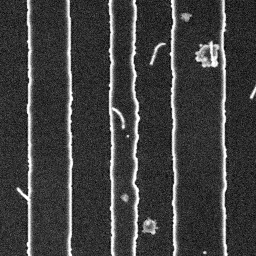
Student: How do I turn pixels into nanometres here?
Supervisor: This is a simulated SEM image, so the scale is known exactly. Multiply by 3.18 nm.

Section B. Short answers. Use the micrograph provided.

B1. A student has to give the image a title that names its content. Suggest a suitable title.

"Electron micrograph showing lines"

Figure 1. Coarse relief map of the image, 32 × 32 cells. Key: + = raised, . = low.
...++++++.....+++....+++++++....
...++++++.....+++.....++++++....
...++++++.....+++.....++++++....
...++++++.....+++....+++++++....
....+++++.....+++....+++++++....
...++++++.....+++....+++++++....
....+++++.....+++....+++++++....
....+++++.....+++....+++++++....
....+++++.....+++....+++++++....
....+++++.....+++.....++++++....
....+++++.....+++....+++++++....
....+++++.....+++....+++++++....
....+++++.....+++....+++++++....
...++++++.....+++....+++++++....
...++++++.....+++.....++++++....
....+++++.....+++.....++++++....
....+++++.....+++.....++++++....
....+++++.....+++.....++++++....
....+++++.....+++.....++++++....
....+++++.....+++.....++++++....
....+++++.....+++.....++++++....
....+++++.....+++.....++++++....
....+++++.....+++.....++++++....
....+++++.....+++.....++++++....
...++++++.....+++.....++++++....
...++++++.....+++.....++++++....
....+++++.....+++.....++++++....
....+++++.....+++.....++++++....
....+++++.....+++.+...++++++....
....+++++.....+++.....++++++....
...++++++.....+++.....++++++....
...++++++.....+++.....++++++....